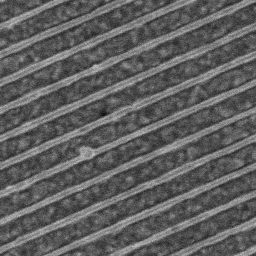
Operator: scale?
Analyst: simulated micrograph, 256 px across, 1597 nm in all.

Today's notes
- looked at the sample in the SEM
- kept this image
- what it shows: parallel lines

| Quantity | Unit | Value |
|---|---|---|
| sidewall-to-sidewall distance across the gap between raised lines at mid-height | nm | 131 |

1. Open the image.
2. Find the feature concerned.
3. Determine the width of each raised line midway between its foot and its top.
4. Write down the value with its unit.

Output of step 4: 29.9 nanometres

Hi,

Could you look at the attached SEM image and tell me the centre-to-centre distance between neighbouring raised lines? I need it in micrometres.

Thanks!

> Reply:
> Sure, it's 0.159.